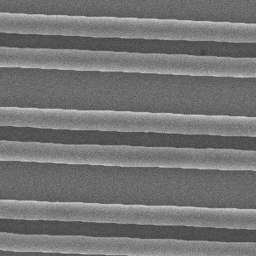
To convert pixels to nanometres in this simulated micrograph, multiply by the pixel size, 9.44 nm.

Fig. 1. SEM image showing lines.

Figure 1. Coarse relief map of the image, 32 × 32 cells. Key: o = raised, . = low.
................................
................................
oooooooooooooooooooo............
oooooooooooooooooooooooooooooooo
..........oooooooooooooooooooooo
................................
oooooooooooooo..................
oooooooooooooooooooooooooooooooo
.....ooooooooooooooooooooooooooo
.............................ooo
................................
................................
................................
oo..............................
oooooooooooooooooooooooooo......
oooooooooooooooooooooooooooooooo
..................oooooooooooooo
................................
oooooooooooooooooooooo..........
oooooooooooooooooooooooooooooooo
...........ooooooooooooooooooooo
................................
................................
................................
................................
ooooooooooooo...................
oooooooooooooooooooooooooooooooo
.......ooooooooooooooooooooooooo
............................oooo
oooooo..........................
oooooooooooooooooooooooooooooooo
.....ooooooooooooooooooooooooooo